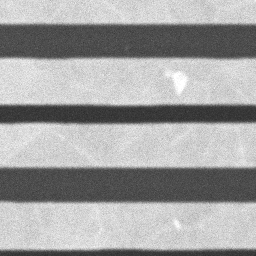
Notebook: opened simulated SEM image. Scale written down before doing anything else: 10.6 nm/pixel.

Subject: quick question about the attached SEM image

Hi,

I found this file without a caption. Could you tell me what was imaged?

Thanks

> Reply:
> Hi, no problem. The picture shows lines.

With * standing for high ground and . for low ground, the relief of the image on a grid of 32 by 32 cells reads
********************************
********************************
********************************
................................
................................
................................
................................
********************************
********************************
********************************
********************************
********************************
********************************
................................
................................
..******..........**************
********************************
********************************
********************************
********************************
********************************
................................
................................
................................
................................
********************************
********************************
********************************
********************************
********************************
********************************
................................